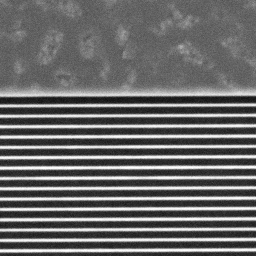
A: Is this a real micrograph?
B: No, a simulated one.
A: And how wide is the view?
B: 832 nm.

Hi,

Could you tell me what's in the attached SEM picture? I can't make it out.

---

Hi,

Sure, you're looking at parallel lines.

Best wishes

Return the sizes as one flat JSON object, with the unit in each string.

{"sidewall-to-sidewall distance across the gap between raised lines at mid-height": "25.6 nanometers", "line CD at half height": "6.5 nanometres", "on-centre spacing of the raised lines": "10.3 px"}